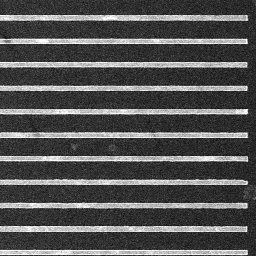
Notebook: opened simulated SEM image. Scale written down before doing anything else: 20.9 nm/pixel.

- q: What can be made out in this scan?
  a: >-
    parallel lines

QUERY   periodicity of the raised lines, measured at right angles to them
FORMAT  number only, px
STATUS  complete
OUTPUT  23.5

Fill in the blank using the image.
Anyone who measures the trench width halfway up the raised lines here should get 0.39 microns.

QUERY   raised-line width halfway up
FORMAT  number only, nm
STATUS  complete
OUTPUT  99.5